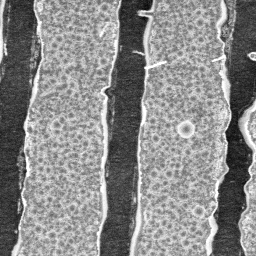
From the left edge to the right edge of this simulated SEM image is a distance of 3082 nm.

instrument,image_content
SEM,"one or a few lines or trenches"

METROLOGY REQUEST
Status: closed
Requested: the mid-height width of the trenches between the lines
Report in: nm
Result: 393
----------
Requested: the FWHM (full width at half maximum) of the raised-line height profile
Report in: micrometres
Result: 0.948